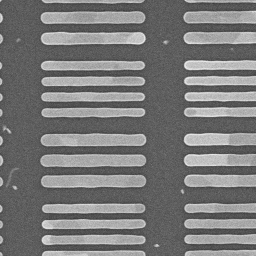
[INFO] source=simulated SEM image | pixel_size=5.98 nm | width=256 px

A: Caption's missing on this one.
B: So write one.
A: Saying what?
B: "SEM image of groups of lines, slits or small figures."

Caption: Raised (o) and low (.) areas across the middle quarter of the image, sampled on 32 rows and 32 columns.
oooooooooooooooooooo..........oo
................................
................................
ooooooooooooooooooo............o
oooooooooooooooooooo..........oo
................................
................................
oooooooooooooooooooo...........o
oooooooooooooooooooo..........oo
................................
................................
oooooooooooooooooooo...........o
oooooooooooooooooooo..........oo
................................
................................
................................
................................
................................
oooooooooooooooooooo..........oo
oooooooooooooooooooo..........oo
................................
................................
................................
oooooooooooooooooooo..........oo
oooooooooooooooooooo..........oo
o...ooo.........................
................................
................................
oooooooooooooooooooo..........oo
oooooooooooooooooooo..........oo
oooooooooooooooooooo...........o
................................